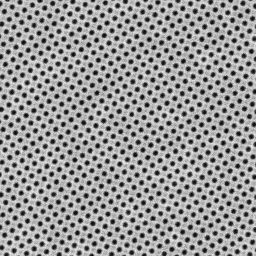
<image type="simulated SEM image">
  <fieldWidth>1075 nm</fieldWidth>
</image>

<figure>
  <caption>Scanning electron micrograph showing a regular array of holes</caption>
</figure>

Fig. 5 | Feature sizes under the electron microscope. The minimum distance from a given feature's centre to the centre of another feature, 0.0371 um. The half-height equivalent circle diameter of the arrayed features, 22.7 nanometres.